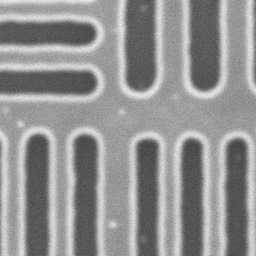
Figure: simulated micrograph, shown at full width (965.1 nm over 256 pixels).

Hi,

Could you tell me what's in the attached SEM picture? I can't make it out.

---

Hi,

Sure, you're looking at groups of lines, slits or small figures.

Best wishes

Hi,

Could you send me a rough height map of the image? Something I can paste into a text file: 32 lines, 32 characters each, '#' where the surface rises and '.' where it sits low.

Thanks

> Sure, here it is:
###############.....###.....###.
###############.....###.....###.
.........######.....###.....###.
............###.....###.....###.
............###.....###.....###.
............###.....###.....###.
###############.....###.....###.
###############.....###.....###.
.#######.######.....###.....###.
............###.....###.....###.
............####...#####...#####
............#####..######.######
################################
################################
################################
################################
################################
###...###...#####...###..###...#
###...###...#####...###...##...#
###...###...#####...##....##...#
###...###...#####...##....##...#
###...###...#####...##....##...#
###...###...#####...##....##...#
###...###...#####...##....##...#
###...###...#####...##....##...#
###...###...#####...##....##...#
###...###...#####...##....##...#
###...###...#####...##....##...#
###...###...#####...##....##...#
###....##...#####...##....##...#
###...###...#####...##....##...#
###...###...#####...##....##...#